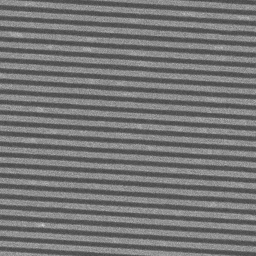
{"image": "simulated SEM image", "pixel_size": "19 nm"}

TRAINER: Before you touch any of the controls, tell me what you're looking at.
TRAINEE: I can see parallel lines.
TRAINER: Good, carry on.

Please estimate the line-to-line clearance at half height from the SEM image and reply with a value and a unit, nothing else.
97.1 nm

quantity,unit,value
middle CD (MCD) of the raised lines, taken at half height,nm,114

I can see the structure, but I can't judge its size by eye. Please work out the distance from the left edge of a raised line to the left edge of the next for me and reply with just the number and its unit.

199 nm